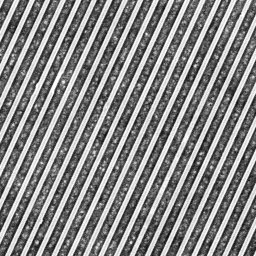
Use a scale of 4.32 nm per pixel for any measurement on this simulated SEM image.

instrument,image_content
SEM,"parallel lines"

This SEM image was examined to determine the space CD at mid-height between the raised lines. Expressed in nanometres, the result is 42.6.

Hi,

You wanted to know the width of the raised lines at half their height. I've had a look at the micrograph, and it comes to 15.7 nm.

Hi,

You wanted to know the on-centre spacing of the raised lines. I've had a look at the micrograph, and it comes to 14.1 pixels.